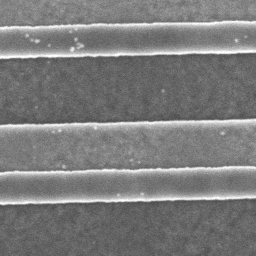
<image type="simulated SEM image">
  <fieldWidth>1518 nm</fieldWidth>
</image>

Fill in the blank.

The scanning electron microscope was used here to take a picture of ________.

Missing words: lines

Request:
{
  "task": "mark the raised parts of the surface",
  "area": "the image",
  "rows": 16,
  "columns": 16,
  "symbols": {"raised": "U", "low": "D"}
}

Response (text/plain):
UUUUUUUUUUUUUUUU
UUUUUUUUUUUUUUUU
UUUUUUUUUUUUUUUU
UUUUDDDDDDDDDDDD
DDDDDDDDDDDDDDDD
DDDDDDDDDDDDDDDD
DDDDDDDDDDDDDDDD
DDDDDDDDDDDDDDDD
UUUUUUUUUUUUUUUU
UUUUUUUUUUUUUUUU
UUUUUUUUUUUUUUUU
UUUUUUUUUUUUUUUU
UUUUUUUUUUDDDDDD
DDDDDDDDDDDDDDDD
DDDDDDDDDDDDDDDD
DDDDDDDDDDDDDDDD